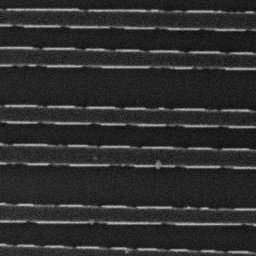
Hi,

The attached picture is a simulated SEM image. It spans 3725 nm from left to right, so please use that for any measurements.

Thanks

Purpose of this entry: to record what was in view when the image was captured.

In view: lines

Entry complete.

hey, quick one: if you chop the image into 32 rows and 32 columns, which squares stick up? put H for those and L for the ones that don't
LLLLLLLLLLLLLLLLLLLLLLLLLLLLLLLL
HHHHHHHHHHHHHHHHHHHHHHHLLLLLLLLL
HHHHHHHHHHHHHHHHHHHHHHHHHHHHHHHH
LLLLLLLLLLLLLLLLLLLLHHHHHHHHHHHH
LLLLLLLLLLLLLLLLLLLLLLLLLLLLLLLL
LLLLLLLLLLLLLLLLLLLLLLLLLLLLLLLL
HHHHHHHHHHHHHHHHHHLLLLLLLLLLLLLL
HHHHHHHHHHHHHHHHHHHHHHHHHHHHHHHH
LLLLLLLLLLLLLLLLLLLLLLLLHHHHHHHH
LLLLLLLLLLLLLLLLLLLLLLLLLLLLLLLL
LLLLLLLLLLLLLLLLLLLLLLLLLLLLLLLL
LLLLLLLLLLLLLLLLLLLLLLLLLLLLLLLL
LLLLLLLLLLLLLLLLLLLLLLLLLLLLLLLL
HHHHHHHHHHLLLLLLLLLLLLLLLLLLLLLL
HHHHHHHHHHHHHHHHHHHHHHHHHHHHHHHH
LLLLLLLLLLLLLLLLHHHHHHHHHHHHHHHH
LLLLLLLLLLLLLLLLLLLLLLLLLLLLLLLL
LLLLLLLLLLLLLLLLLLLLLLLLLLLLLLLL
HHHHHHHHHHHHHHHHHLLLLLLLLLLLLLLL
HHHHHHHHHHHHHHHHHHHHHHHHHHHHHHHH
LLLLLLHHHHHHHHHHHHHHHHHHHHHHHHHH
LLLLLLLLLLLLLLLLLLLLLLLLLLLLLLLL
LLLLLLLLLLLLLLLLLLLLLLLLLLLLLLLL
LLLLLLLLLLLLLLLLLLLLLLLLLLLLLLLL
LLLLLLLLLLLLLLLLLLLLLLLLLLLLLLLL
LLLLLLLLLLLLLLLLLLLLLLLLLLLLLLLL
HHHHHHHHHHHHHHHHHHHHHHHHHHHHHHHH
HHHHHHHHHHHHHHHHHHHHHHHHHHHHHHHH
LLLLLLLLLLLLLLLLLLLLLLLLLLLLLLLL
LLLLLLLLLLLLLLLLLLLLLLLLLLLLLLLL
LLLLLLLLLLLLLLLLLLLLLLLLLLLLLLLL
HHHHHHHHHHHHHHHHHHHHHHHHHHHHLLLL